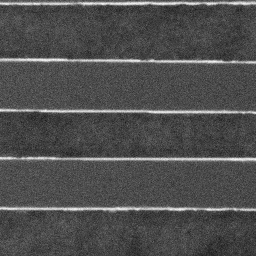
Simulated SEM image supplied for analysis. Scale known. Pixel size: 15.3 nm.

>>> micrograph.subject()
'lines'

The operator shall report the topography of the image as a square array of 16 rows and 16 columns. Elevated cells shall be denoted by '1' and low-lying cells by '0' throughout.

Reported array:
0000000000000000
0000000000000000
0000000000000000
0000000000000000
1111111111111111
1111111111111111
1111111111111111
0000000000000000
0000000000000000
0000000000000000
1111111111111111
1111111111111111
1111111111111111
0000000000000000
0000000000000000
0000000000000000